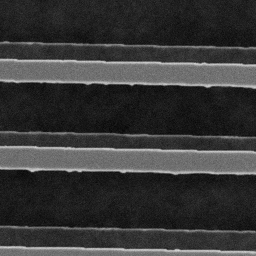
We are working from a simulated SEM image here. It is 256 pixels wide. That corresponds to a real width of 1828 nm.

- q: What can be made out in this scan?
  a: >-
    lines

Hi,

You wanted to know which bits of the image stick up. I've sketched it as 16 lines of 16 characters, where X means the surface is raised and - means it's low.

----------------
----------------
----------------
XXXXXXXXXXXXXXXX
XXXXXXXXXXXXXXXX
---------------X
----------------
----------------
XXXXXXXXXXXX----
XXXXXXXXXXXXXXXX
XXXXXXXXXXXXXXXX
----------------
----------------
----------------
XXXXXXXXXXXXXXXX
XXXXXXXXXXXXXXXX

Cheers